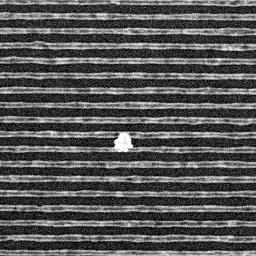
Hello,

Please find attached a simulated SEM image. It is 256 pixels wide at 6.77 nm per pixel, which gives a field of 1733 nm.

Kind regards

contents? parallel lines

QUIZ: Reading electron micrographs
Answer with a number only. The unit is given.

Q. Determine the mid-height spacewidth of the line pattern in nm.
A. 69.4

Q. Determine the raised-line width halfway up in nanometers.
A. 31.3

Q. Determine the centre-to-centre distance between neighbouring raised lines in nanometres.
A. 100